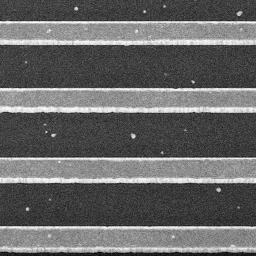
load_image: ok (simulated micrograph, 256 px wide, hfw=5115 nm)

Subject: lines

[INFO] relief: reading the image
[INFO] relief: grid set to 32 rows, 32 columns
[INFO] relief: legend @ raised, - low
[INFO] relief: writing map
--------------------------------
--------------------------------
--------------------------------
@@@@@@@@@@@@@@@@@@@@@@@@@@@@@@@@
@@@@@@@@@@@@@@@@@@@@@@@@@@@@@@@@
--------------------------------
--------------------------------
--------------------------------
--------------------------------
--------------------------------
--------------------------------
@@@@@@@@@@@@@@@@@@@@@@@@@@@@@@@@
@@@@@@@@@@@@@@@@@@@@@@@@@@@@@@@@
@@@@@@@@@@@@@@@@@@@@@@@@@@@@@@@@
--------------------------------
--------------------------------
--------------------------------
--------------------------------
--------------------------------
--------------------------------
@@@@@@@@@@@@@@@@@@@@@@@@@@@@@@@@
@@@@@@@@@@@@@@@@@@@@@@@@@@@@@@@@
@-@@@@@@@@@@@@@@@@@@@@@@@@@@@@@@
--------------------------------
--------------------------------
--------------------------------
--------------------------------
--------------------------------
@@@@@@@@@@@@@@@@@@@@@@@@@@@@@@@@
@@@@@@@@@@@@@@@@@@@@@@@@@@@@@@@@
@@@@@@@@@@@@@@@@@@@@@@@@@@@@@@@@
--------------------------------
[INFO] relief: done